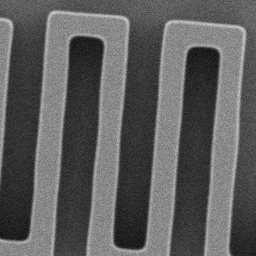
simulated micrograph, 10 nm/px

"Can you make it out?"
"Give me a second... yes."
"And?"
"groups of lines, slits or small figures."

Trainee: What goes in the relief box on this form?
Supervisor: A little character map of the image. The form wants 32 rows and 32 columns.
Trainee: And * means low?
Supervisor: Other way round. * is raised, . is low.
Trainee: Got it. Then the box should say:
................................
.......*........................
*.....**********................
*.....**********.....*********..
*.....****.*****....***********.
*.....***....***....***********.
*.....***....***....***....***..
*.....***....***....***.....**..
*.....***....***....***....***..
*....***.....***....***....***..
*....***.....***....***....***..
*....***.....***....***....***..
*....***.....**.....***....***..
*....***....***.....***....***..
*....***....***.....***....***..
*....***....***.....***....***..
*....***....***....***.....***..
.....***....***....***.....***..
.....***....***....***.....***..
.....***....***....***....****..
....****....***....***....***...
....***.....***....***....***...
....***.....***....***....***...
....***.....***....***....***...
....***.....**.....***....***...
....***.....**.....***....***...
....***....***.....***....***...
....***....***.....***....***...
....***....***....***.....***...
....***....***....***.....***...
*******....***....***.....***...
*******....**********.....***...